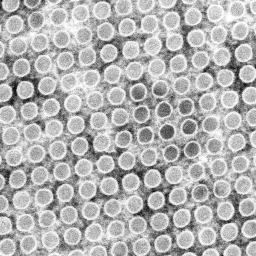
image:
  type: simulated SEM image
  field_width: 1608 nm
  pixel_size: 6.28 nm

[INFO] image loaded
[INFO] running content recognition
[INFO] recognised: a regular array of raised bodies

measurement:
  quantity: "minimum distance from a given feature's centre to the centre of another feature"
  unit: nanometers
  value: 135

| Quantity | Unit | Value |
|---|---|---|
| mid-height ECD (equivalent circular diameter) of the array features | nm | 107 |